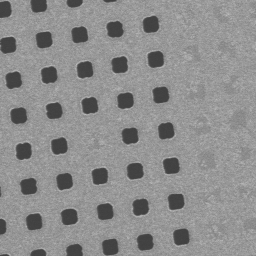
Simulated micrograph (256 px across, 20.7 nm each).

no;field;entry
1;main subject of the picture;a regular array of holes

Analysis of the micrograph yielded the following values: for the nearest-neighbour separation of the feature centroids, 735 nm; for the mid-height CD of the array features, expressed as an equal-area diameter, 356 nm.